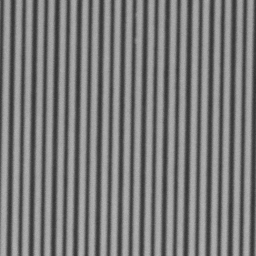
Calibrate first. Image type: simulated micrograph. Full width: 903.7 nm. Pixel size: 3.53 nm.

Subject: parallel lines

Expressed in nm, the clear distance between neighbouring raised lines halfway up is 19.4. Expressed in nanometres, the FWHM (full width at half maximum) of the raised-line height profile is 22.9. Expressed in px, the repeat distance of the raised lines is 11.